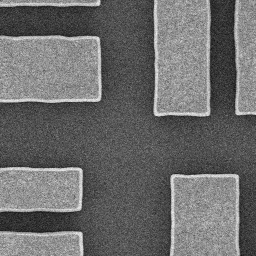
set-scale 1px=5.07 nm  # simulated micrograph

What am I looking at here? groups of lines, slits or small figures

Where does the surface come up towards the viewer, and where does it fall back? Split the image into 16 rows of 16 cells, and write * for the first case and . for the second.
..........***..*
..........***..*
******....***..*
******....***..*
******....***..*
******....***..*
..........***..*
................
................
................
................
*****......****.
*****......****.
...........****.
...........****.
*****......****.